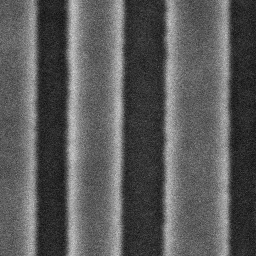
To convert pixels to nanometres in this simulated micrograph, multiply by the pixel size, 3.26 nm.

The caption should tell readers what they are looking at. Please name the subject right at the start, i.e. lines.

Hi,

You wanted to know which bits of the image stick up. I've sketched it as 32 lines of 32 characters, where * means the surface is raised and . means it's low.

****.....******......********...
*****....******......********...
****.....******......********...
****.....******......********...
****.....******......********...
****.....******......********...
****.....******......********...
****.....******......********...
****.....******......********...
****.....******......********...
****.....******......********...
****.....******......********...
****.....******......********...
****.....******......*******....
****.....******......********...
****.....******......********...
****.....******......********...
****.....******......********...
****.....******......********...
****.....******......********...
****.....******......********...
****.....******......********...
****.....******......********...
****.....******......*******....
****.....******......********...
****.....******......********...
****.....******......*******....
****.....******......********...
****.....******......********...
****.....******......********...
****.....******......*******....
****.....******......********...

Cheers